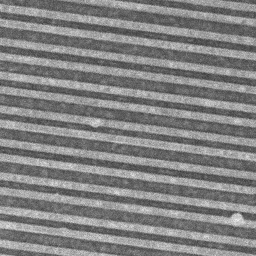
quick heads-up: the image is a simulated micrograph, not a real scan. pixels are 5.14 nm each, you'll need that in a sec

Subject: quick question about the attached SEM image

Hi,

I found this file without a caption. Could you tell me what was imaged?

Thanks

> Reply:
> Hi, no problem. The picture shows parallel lines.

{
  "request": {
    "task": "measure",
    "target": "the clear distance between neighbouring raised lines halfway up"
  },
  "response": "42.6 nm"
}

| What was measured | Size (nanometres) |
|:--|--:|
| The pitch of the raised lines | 85.4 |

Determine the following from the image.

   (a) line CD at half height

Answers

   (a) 6.56 pixels